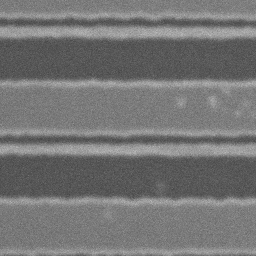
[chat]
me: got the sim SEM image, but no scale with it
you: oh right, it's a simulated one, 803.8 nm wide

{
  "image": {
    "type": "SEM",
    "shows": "lines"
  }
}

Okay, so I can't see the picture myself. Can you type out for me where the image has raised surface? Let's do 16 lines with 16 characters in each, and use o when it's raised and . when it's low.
oooooooooooooooo
oooooooooooooooo
................
................
................
oooooooooooooooo
oooooooooooooooo
oooooooooooooooo
oooooooooooooooo
oooooooooooooooo
................
................
oooooooo.o....o.
oooooooooooooooo
oooooooooooooooo
oooooooooooooooo